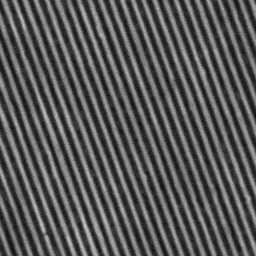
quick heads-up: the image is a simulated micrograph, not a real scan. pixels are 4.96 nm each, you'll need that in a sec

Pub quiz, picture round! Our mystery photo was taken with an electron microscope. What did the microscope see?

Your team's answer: parallel lines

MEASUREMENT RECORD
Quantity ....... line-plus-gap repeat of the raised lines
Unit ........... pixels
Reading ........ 10.1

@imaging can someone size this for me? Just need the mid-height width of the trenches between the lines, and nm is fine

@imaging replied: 30.3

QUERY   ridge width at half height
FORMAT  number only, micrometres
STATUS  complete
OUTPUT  0.0175